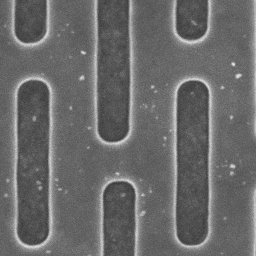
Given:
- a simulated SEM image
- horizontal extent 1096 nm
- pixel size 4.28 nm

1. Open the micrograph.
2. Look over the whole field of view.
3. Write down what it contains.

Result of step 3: holes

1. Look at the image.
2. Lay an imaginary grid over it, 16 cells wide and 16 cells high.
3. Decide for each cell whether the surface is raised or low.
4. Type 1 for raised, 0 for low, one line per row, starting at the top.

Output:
1001110011100111
1001110011100111
1011110011111111
1111110011111111
1111110011111111
1001110011100111
1001110011100111
1001110011100111
1001110011100111
1001111111100111
1001111111100111
1001111011100111
1001110011100111
1001110001100111
1001110001100111
1111110011111111